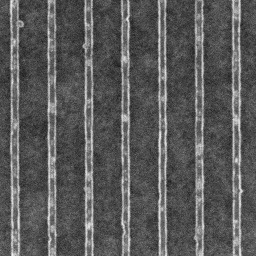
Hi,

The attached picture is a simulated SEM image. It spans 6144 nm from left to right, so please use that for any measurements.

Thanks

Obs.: parallel lines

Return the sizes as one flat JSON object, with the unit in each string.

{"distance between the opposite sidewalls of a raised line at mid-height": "159 nm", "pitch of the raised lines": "36.9 px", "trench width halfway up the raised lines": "729 nanometres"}